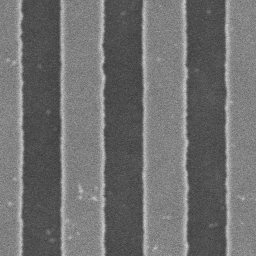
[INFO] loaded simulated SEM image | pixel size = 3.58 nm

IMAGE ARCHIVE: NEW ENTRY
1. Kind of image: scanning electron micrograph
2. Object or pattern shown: lines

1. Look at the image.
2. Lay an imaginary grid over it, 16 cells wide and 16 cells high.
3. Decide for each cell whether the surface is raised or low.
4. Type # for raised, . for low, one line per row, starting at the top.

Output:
#...##...###..##
#...##...###..##
#...##...###..##
#...##...###..##
#...##...###..##
#...##...###..##
#...##...###..##
#...###..###..##
#...##...###..##
#...###..###..##
#...##...###..##
#...###..###..##
#...###..###..##
#...##...###..##
#...###..###..##
#...###..###..##